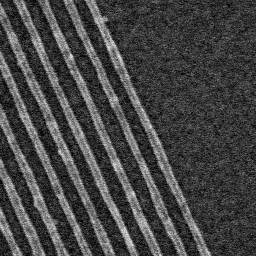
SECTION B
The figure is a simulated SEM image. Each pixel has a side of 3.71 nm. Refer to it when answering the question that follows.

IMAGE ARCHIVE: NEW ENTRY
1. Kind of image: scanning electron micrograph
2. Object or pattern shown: parallel lines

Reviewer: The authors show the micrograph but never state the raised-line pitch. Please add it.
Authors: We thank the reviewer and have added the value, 0.0796 micrometres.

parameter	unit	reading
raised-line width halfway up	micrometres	0.025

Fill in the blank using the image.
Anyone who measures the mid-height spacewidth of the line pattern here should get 57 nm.